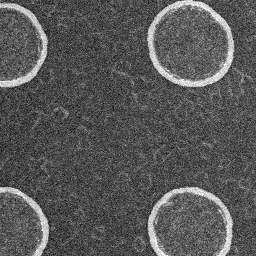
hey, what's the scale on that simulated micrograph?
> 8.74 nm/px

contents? raised bodies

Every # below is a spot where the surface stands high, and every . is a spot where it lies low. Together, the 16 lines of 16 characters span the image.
#..........##...
##........####..
###......#####..
###.......####..
##........####..
................
................
................
................
................
................
................
##........####..
###.......####..
###......#####..
###.......####..